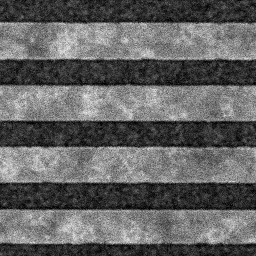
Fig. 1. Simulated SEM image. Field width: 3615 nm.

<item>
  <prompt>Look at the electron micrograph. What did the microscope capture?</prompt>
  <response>one or a few lines or trenches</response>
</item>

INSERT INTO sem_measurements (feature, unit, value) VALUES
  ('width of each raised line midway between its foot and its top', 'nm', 478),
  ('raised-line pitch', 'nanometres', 872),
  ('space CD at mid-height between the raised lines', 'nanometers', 397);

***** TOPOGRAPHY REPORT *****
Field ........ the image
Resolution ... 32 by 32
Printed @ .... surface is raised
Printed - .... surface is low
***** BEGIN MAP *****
--------------------------------
--------------------------------
--------------------------------
@@@@@@@@@@@@@@@@@@@@@@@@@@@@@@@@
@@@@@@@@@@@@@@@@@@@@@@@@@@@@@@@@
@@@@@@@@@@@@@@@@@@@@@@@@@@@@@@@@
@@@@@@@@@@@@@@@@@@@@@@@@@@@@@@@@
--------------------------------
--------------------------------
--------------------------------
--------------------------------
@@@@@@@@@@@@@@@@@@@@@@@@@@@@@@@@
@@@@@@@@@@@@@@@@@@@@@@@@@@@@@@@@
@@@@@@@@@@@@@@@@@@@@@@@@@@@@@@@@
@@@@@@@@@@@@@@@@@@@@@@@@@@@@@@@@
--------------------------------
--------------------------------
--------------------------------
----@---------------------------
@@@@@@@@@@@@@@@@@@@@@@@@@@@@@@@@
@@@@@@@@@@@@@@@@@@@@@@@@@@@@@@@@
@@@@@@@@@@@@@@@@@@@@@@@@@@@@@@@@
@@@@@@@@@@@@@@@@@@@@@@@@@@@@@@@@
--------------------------------
--------------------------------
--------------------------------
@@@@@@@@@@@@@@@@@@@@@@@@@@@@@@@@
@@@@@@@@@@@@@@@@@@@@@@@@@@@@@@@@
@@@@@@@@@@@@@@@@@@@@@@@@@@@@@@@@
@@@@@@@@@@@@@@@@@@@@@@@@@@@@@@@@
--------------------------------
--------------------------------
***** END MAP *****